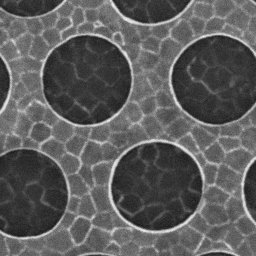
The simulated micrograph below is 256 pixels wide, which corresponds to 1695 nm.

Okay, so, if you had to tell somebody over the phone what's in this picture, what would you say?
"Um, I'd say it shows holes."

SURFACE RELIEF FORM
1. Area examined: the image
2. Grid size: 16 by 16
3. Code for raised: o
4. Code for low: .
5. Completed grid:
....ooo.....oooo
ooooooooo.oooooo
oooo...ooooo...o
ooo.....ooo.....
.oo.....ooo.....
.oo.....ooo.....
ooo.....ooo.....
oooo...ooooo...o
oooooooooooooooo
o..ooooo....oooo
....ooo.....oooo
....ooo......oo.
....ooo......oo.
....oooo....oooo
...ooooooooooooo
oooooooooooooooo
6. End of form